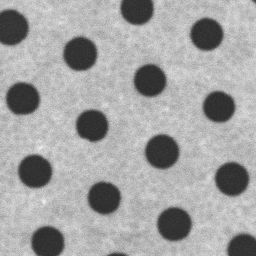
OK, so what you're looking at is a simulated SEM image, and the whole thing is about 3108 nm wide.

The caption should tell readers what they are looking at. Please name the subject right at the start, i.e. a regular array of holes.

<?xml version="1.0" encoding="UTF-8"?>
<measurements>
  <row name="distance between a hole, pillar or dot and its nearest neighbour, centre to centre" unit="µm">0.884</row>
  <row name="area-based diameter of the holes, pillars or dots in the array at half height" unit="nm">409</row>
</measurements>